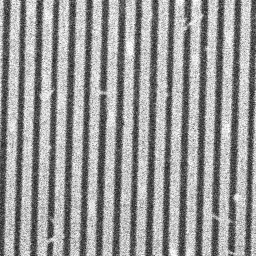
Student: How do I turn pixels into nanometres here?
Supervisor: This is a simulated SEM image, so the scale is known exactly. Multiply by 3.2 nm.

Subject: parallel lines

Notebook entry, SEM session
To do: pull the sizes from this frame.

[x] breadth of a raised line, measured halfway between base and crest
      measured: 30 nm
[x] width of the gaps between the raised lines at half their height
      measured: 24 nm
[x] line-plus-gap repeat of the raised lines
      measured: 0.0527 microns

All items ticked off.